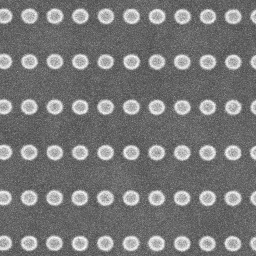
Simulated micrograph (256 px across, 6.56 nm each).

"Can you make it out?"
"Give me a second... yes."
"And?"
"a regular array of raised bodies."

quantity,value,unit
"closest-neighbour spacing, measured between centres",166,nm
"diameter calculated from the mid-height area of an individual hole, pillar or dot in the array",0.0929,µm